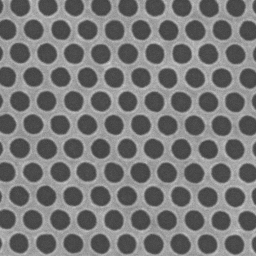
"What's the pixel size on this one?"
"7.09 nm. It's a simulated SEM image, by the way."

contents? a regular array of holes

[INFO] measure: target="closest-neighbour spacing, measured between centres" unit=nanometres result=190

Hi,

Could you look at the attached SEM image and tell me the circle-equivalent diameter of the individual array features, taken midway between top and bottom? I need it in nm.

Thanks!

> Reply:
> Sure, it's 149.